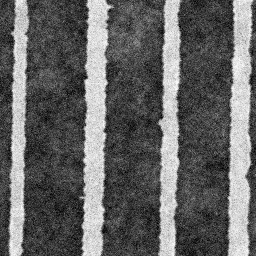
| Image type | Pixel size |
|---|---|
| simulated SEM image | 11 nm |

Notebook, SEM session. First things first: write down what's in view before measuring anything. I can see one or a few lines or trenches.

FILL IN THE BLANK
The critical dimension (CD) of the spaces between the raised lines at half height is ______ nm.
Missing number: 649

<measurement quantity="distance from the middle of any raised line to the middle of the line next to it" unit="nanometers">810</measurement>